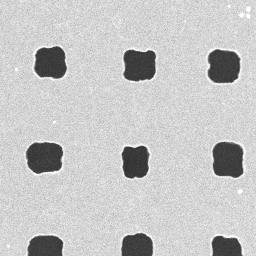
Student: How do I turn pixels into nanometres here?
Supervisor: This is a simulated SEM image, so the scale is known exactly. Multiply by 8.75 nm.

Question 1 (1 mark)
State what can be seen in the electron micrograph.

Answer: holes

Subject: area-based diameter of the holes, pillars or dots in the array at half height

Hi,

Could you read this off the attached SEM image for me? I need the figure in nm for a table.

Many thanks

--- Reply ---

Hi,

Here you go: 300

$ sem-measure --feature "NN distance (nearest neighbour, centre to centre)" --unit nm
790